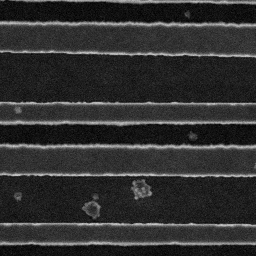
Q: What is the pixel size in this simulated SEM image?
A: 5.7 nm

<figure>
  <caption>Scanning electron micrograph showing lines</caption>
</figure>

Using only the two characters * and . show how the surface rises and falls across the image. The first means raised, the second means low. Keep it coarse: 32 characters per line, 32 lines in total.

................................
................................
................................
********************************
********************************
********************************
********************************
................................
................................
................................
................................
................................
................................
********************************
********************************
................................
................................
................................
********************************
********************************
********************************
********************************
................................
................................
................................
................................
................................
................................
********************************
********************************
.*...****......*.****......*...*
................................